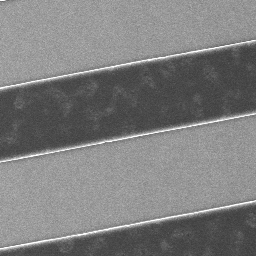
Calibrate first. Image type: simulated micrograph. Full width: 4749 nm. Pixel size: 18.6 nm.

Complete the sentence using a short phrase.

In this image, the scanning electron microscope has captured one or a few lines or trenches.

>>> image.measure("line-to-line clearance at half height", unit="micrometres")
1.58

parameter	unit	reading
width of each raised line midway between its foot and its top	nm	1360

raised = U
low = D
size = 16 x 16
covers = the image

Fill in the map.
DDDDDDDDDDDDDDDD
DDDDDDDDDDDDDDDD
DDDDDDDDDDDDDDDD
DDDDDDDDDDDUUUUU
DDDDDUUUUUUUUUUU
UUUUUUUUUUUUUUUU
UUUUUUUUUUUUUUUU
UUUUUUUUUUUUUUDD
UUUUUUUUUDDDDDDD
UUUDDDDDDDDDDDDD
DDDDDDDDDDDDDDDD
DDDDDDDDDDDDDDDD
DDDDDDDDDDDDDDDD
DDDDDDDDDDDUUUUU
DDDDDDUUUUUUUUUU
UUUUUUUUUUUUUUUU